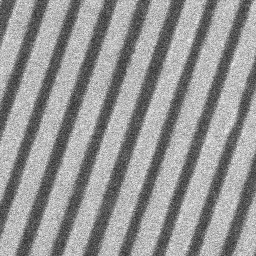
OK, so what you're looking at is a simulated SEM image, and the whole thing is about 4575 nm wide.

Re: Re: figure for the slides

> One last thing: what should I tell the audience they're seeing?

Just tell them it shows parallel lines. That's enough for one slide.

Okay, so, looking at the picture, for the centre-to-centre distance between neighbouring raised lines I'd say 574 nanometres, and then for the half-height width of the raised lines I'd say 0.298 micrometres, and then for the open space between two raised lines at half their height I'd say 272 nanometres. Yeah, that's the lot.